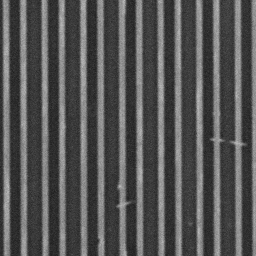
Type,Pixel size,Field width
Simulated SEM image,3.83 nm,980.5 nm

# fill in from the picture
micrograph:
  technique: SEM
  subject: parallel lines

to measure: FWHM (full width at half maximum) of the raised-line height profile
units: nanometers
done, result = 20.6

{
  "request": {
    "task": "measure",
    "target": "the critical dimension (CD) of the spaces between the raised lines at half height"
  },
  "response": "45.5 nm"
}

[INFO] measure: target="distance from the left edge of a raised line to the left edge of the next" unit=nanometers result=73.9